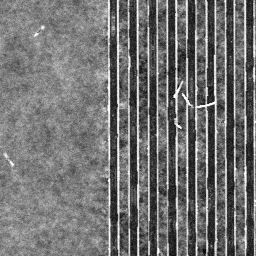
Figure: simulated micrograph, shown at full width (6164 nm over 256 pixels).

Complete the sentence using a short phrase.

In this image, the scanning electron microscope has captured parallel lines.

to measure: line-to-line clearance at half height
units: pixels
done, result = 9.5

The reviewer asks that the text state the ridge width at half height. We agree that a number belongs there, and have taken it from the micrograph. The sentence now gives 229 nanometres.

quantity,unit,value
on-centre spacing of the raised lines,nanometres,469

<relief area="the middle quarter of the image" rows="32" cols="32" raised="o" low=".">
...........oo...oo...oo...oo...o
...........oo...oo...oo...oo...o
...........oo...oo...ooo..oo...o
...........oo...oo...oo...oo...o
...........oo...oo...oo...oo...o
...........oo...oo...oo...oo...o
...........oo...oo...oo...ooo..o
...........ooo..oo...oo...oo...o
...........ooo..oo...oo...oo..oo
...........ooo..oo...oo...oo...o
...........ooo..oo...oo...oo...o
...........ooo..oo...oo...oo...o
...........oo...oo...oo...oo...o
...........oo...oo...oo...oo...o
...........oo...oo...oo...oo...o
...........oo...oo...oo...ooo..o
...........oo...oo...oo...oo...o
...........oo...oo...oo...oo...o
...........oo...oo...oo...oo...o
...........oo...oo...oo...oo...o
...........oo...oo...oo...oo...o
...........oo...oo...oo...oo...o
...........oo...oo...oo...oo...o
...........oo...ooo..oo...oo...o
...........oo...oo...oo...oo...o
...........oo...oo...oo...oo...o
...........ooo..oo...oo...oo...o
...........ooo..oo...oo...oo...o
...........ooo..oo...oo...oo...o
...........oo...oo...oo...oo...o
...........oo...oo...oo...oo...o
...........oo...oo...oo...oo...o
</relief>